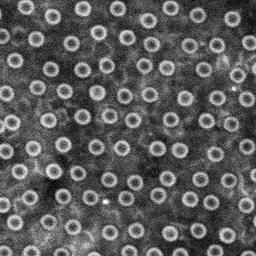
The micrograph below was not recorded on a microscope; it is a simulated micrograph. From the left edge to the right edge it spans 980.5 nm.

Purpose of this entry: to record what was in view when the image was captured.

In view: a regular array of raised bodies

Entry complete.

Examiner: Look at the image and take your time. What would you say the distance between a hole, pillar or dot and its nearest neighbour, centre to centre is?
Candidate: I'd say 98.7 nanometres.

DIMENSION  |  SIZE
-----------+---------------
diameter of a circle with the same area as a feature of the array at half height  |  54.5 nm